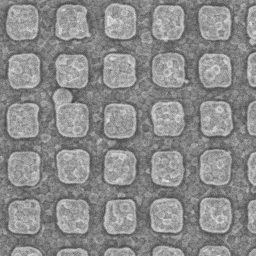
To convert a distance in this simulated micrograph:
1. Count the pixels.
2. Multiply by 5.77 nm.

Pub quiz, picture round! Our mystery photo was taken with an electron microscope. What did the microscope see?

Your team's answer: a regular array of raised bodies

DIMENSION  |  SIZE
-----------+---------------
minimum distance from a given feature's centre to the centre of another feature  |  270 nanometres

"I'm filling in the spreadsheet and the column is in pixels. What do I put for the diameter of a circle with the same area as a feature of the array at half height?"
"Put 35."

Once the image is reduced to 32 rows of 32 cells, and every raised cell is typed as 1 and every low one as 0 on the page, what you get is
00000000000000000000000000000000
01111001111001111001111001111001
01111001111001111001111001111001
01111001111001111001111001111001
01110001111000111001110001111001
00000000000000000000000000000000
00000000000000000000000000000000
01111001111001111001111001111001
01111001111001111001111001111001
01111001111001111001111001111001
01111001111001111000111000111001
00000001000000000000000000000000
00000001100000000000000000000000
01111001111001111001111001111001
01111001111001111001111001111001
01111001111001111001111001111001
01111000111001111001111001111001
00000000000000000000000000000000
00000000000000000000000000000000
01111001111001111001111001111001
01111001111001111001111001111001
01111001111001111001111001111001
01111000111001111001111001111001
00000000000000000000000000000000
00000000000000000000000000000000
01111001111001111001111001111001
01111001111001111001111001111001
01111001111001111001111001111001
01111000111001111001111001111001
00000000000000000000000000000000
00000000000000000000000000000000
00111001111001111001111001111001